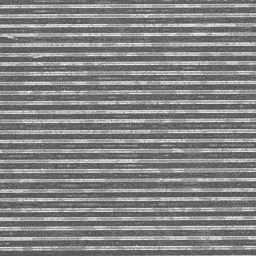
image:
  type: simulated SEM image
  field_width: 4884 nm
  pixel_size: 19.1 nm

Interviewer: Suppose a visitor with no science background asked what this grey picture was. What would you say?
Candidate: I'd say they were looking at parallel lines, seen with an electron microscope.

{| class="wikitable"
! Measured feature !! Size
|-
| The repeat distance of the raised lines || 185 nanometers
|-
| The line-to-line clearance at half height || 122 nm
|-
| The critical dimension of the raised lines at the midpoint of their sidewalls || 52.5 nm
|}